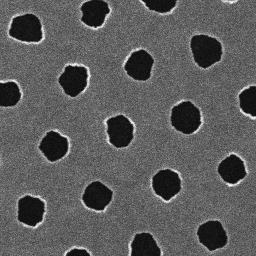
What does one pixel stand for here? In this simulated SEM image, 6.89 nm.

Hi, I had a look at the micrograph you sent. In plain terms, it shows a regular array of holes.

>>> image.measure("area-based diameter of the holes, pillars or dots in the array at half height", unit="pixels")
29.4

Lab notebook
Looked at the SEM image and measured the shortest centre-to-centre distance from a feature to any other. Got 464 nm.